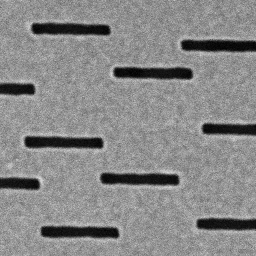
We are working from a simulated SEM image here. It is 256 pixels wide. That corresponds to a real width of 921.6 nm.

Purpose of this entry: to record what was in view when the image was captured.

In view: holes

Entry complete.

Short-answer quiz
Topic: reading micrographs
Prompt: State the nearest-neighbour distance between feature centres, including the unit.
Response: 307 nanometers